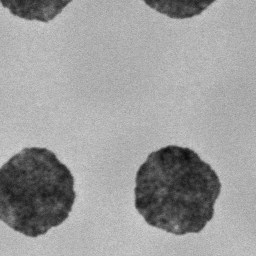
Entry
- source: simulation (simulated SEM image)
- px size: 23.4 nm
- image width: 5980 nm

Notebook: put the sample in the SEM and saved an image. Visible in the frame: holes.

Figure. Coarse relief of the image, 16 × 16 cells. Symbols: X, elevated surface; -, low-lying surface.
----XXXXX----XXX
XXXXXXXXXXXXXXXX
XXXXXXXXXXXXXXXX
XXXXXXXXXXXXXXXX
XXXXXXXXXXXXXXXX
XXXXXXXXXXXXXXXX
XXXXXXXXXXXXXXXX
XXXXXXXXXXXXXXXX
XXXXXXXXXXXXXXXX
X--XXXXXXX--XXXX
----XXXXX----XXX
-----XXX------XX
-----XXX------XX
----XXXXX----XXX
X--XXXXXXX--XXXX
XXXXXXXXXXXXXXXX